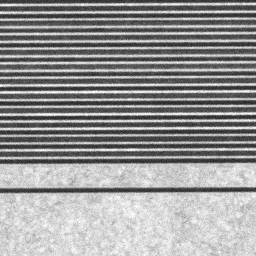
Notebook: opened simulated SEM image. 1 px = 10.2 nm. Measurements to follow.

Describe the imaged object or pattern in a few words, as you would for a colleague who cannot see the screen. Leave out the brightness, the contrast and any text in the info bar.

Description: parallel lines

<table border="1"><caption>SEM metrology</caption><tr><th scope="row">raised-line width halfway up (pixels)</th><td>1.87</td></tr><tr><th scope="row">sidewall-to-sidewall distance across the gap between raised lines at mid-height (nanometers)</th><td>57.1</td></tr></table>